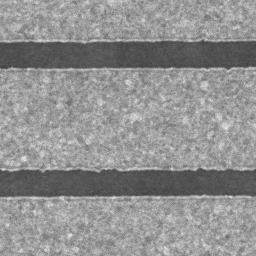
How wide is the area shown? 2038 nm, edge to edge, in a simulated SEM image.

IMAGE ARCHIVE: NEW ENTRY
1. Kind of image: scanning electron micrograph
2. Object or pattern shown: one or a few lines or trenches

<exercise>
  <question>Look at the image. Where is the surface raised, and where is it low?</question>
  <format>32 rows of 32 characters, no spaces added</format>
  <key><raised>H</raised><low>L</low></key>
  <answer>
HHHHHHHHHHHHHHHHHHHHHHHHHHHHHHHH
HHHHHHHHHHHHHHHHHHHHHHHHHHHHHHHH
HHHHHHHHHHHHHHHHHHHHHHHHHHHHHHHH
HHHHHHHHHHHHHHHHHHHHHHHHHHHHHHHH
HHHHHHHHHHHHHHHHHHHHHHHHHHHHHHHH
LLLLLLLLLLLLLLLLLLLLLLLLLLLLLLLL
LLLLLLLLLLLLLLLLLLLLLLLLLLLLLLLL
LLLLLLLLLLLLLLLLLLLLLLLLLLLLLLLL
LLLLLLLLLLLLLLLLLLLLLLLLLLLLLLLL
HHHHHHHHHHHHHHHHHHHHHHHHHHHHHHHH
HHHHHHHHHHHHHHHHHHHHHHHHHHHHHHHH
HHHHHHHHHHHHHHHHHHHHHHHHHHHHHHHH
HHHHHHHHHHHHHHHHHHHHHHHHHHHHHHHH
HHHHHHHHHHHHHHHHHHHHHHHHHHHHHHHH
HHHHHHHHHHHHHHHHHHHHHHHHHHHHHHHH
HHHHHHHHHHHHHHHHHHHHHHHHHHHHHHHH
HHHHHHHHHHHHHHHHHHHHHHHHHHHHHHHH
HHHHHHHHHHHHHHHHHHHHHHHHHHHHHHHH
HHHHHHHHHHHHHHHHHHHHHHHHHHHHHHHH
HHHHHHHHHHHHHHHHHHHHHHHHHHHHHHHH
HHHHHHHHHHHHHHHHHHHHHHHHHHHHHHHH
LLLLLLLLLLLLLLLLLLLLLLLLLLLLLLLL
LLLLLLLLLLLLLLLLLLLLLLLLLLLLLLLL
LLLLLLLLLLLLLLLLLLLLLLLLLLLLLLLL
LLLLLLLLLLLLLLLLLLLLLLLLLLLLLLLL
HHHHHHHHHHHHHHHHHHHHHHHHHHHHHHHH
HHHHHHHHHHHHHHHHHHHHHHHHHHHHHHHH
HHHHHHHHHHHHHHHHHHHHHHHHHHHHHHHH
HHHHHHHHHHHHHHHHHHHHHHHHHHHHHHHH
HHHHHHHHHHHHHHHHHHHHHHHHHHHHHHHH
HHHHHHHHHHHHHHHHHHHHHHHHHHHHHHHH
HHHHHHHHHHHHHHHHHHHHHHHHHHHHHHHH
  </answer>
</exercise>